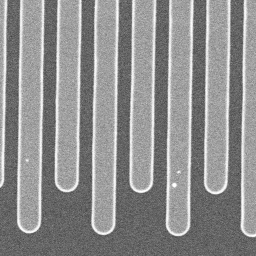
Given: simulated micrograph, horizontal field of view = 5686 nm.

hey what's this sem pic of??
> groups of lines, slits or small figures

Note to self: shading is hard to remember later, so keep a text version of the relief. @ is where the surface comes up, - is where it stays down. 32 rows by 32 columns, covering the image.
@--@@--@@@--@@@--@@--@@@--@@@--@
@--@@--@@@--@@@--@@--@@@--@@@--@
@--@@--@@@--@@@--@@--@@@--@@@--@
@--@@--@@@--@@@--@@--@@@--@@@--@
@--@@--@@@--@@@--@@--@@@--@@@--@
@--@@--@@@--@@@--@@--@@@--@@@--@
@--@@--@@@--@@@--@@--@@@--@@@-@@
@--@@--@@@--@@@--@@--@@@--@@@-@@
@--@@--@@@--@@@--@@--@@@--@@@-@@
@--@@--@@@--@@@--@@--@@@--@@@-@@
@--@@--@@@--@@@--@@--@@@--@@--@@
@--@@--@@@--@@@-@@@--@@@--@@--@@
@--@@--@@@--@@@-@@@--@@@--@@--@@
@-@@@--@@@--@@@-@@@--@@@--@@--@@
@-@@@--@@@--@@--@@@--@@@--@@--@@
--@@@--@@@--@@--@@@--@@@--@@--@@
--@@@--@@@--@@--@@@--@@@--@@--@@
--@@@--@@@--@@--@@@--@@@--@@--@@
--@@@--@@@--@@--@@@--@@@--@@--@@
--@@@--@@@--@@--@@@--@@@--@@--@@
--@@@--@@@--@@--@@@--@@@--@@--@@
--@@@--@@@--@@--@@@--@@@--@@--@@
--@@@--@@@--@@--@@@--@@@--@@--@@
--@@@--@@---@@---@@--@@@--@@--@@
--@@@-------@@-------@@@------@@
--@@@-------@@-------@@@------@@
--@@@-------@@-------@@@------@@
--@@@-------@@-------@@@------@@
---@@-------@@-------@@@------@@
--------------------------------
--------------------------------
--------------------------------